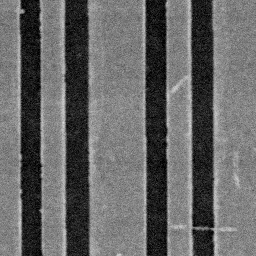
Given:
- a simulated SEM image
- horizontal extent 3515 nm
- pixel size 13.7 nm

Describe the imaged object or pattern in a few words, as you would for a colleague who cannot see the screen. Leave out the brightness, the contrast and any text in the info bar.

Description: lines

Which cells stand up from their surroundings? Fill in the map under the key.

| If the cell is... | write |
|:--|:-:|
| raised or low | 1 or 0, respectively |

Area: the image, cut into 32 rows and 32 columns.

11000111000011111100011100011111
11000111000011111100011100011111
11000111000011111100011100011111
11000111000011111100011100011111
11000111000011111100011100011111
11000111000011111100011100011111
11000111000011111100011100011111
11000111000011111100011100011111
11000111000011111100011100011111
11000111000011111100011100011111
11000111000011111100011100011111
11000111000011111100011100011111
11000111000011111100011100011111
11000111000011111100011100011111
11000111000011111100011100011111
11000111000011111100011100011111
11000111000011111100011100011111
11000111000111111100011100011111
11000111000111111100011100011111
11000111000111111100011100011111
11000111000111111100011100011111
11000111000011111100011100011111
11000111000011111100011100011111
11000111000011111100011100011111
11000111000011111100011100011111
11000111000011111100011100011111
11000111000011111100011100011111
11000111000011111100011100011111
11000111000011111100011100011111
11000111000011111100011100011111
11000111000011111100011100011111
11000111000011111100011100011111